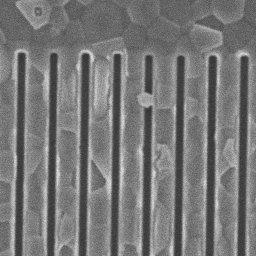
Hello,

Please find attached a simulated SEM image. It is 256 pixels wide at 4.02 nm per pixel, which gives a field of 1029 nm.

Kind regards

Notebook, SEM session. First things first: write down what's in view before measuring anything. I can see parallel lines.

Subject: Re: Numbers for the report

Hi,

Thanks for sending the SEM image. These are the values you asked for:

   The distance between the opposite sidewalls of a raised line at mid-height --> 97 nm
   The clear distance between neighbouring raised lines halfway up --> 30.1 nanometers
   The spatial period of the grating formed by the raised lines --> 0.128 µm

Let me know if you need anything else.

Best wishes